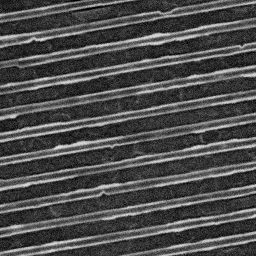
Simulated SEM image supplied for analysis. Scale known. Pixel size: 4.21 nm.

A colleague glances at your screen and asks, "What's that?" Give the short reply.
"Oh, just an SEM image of parallel lines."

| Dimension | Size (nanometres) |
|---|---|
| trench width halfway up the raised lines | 61.7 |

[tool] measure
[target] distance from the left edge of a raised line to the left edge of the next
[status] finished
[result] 0.0987 microns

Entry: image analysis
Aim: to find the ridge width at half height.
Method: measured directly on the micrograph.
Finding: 8.62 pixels